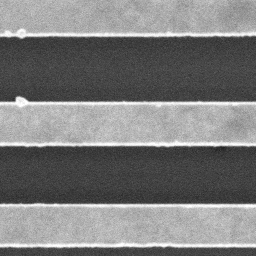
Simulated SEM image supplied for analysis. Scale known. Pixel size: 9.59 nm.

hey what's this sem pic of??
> lines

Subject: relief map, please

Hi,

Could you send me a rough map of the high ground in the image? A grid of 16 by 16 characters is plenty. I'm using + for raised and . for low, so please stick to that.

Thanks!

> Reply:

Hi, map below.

++++++++++++++++
++++++++++++++++
................
................
................
................
++++++++++++++++
++++++++++++++++
++++++++++++++++
................
................
................
................
++++++++++++++++
++++++++++++++++
................